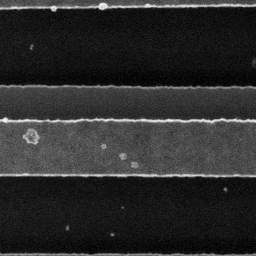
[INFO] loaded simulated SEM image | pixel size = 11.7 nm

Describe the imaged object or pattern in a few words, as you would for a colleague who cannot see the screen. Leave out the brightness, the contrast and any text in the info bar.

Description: lines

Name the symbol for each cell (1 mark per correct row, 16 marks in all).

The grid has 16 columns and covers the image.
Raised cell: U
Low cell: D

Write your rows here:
UUUUUDUDDDDDDDDD
DDDDDDDDDDDDDDDD
DDDDDDDDDDDDDDDD
DDDDDDDDDDDDDDDD
DDDDDDDDDDDDDDDD
UUUUUUUUUUUUUUUU
UUUUUUUUUUUUUUUU
UUUUUUUUUUUUUUUU
UUUUUUUUUUUUUUUU
UUUUUUUUUUUUUUUU
UUUUUUUUUUUUUUUU
DDDDDDDDDDDDDDDD
DDDDDDDDDDDDDDDD
DDDDDDDDDDDDDDDD
DDDDDDDDDDDDDDDD
DDDDDDDDDDDDDDDD